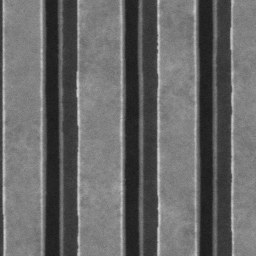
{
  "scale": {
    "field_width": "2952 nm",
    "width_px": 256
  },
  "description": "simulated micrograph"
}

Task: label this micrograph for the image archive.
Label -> lines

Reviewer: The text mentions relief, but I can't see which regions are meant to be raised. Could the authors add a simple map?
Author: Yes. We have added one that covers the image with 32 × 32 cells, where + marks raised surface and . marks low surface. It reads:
+++++...+++++++...++++++...+++++
+++++...+++++++...++++++...+++++
+++++...+++++++...++++++...+++++
+++++...+++++++...++++++...+++++
+++++...+++++++...++++++...+++++
+++++...+++++++...++++++...+++++
+++++...+++++++...+++++++..+++++
+++++...+++++++...+++++++..+++++
+++++...+++++++...+++++++..+++++
+++++...+++++++...+++++++..+++++
+++++...+++++++...+++++++..+++++
+++++...+++++++...+++++++..+++++
+++++...+++++++...+++++++..+++++
+++++...+++++++...+++++++..+++++
+++++...+++++++...+++++++..+++++
+++++...+++++++...+++++++..+++++
+++++...+++++++...+++++++..+++++
+++++...+++++++...+++++++..+++++
+++++...+++++++...+++++++..+++++
+++++...+++++++...+++++++..+++++
+++++...+++++++...+++++++..+++++
+++++...+++++++...+++++++..+++++
+++++...+++++++...+++++++..+++++
+++++...+++++++...+++++++..+++++
+++++...+++++++...+++++++..+++++
+++++...+++++++...+++++++..+++++
+++++...+++++++...+++++++..+++++
+++++...+++++++...+++++++..+++++
+++++...+++++++...+++++++..+++++
+++++...+++++++...+++++++..+++++
+++++...+++++++...+++++++..+++++
+++++...+++++++...+++++++..+++++